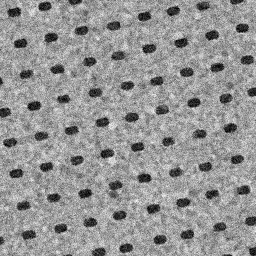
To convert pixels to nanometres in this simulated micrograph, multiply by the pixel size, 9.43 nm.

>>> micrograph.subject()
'a regular array of holes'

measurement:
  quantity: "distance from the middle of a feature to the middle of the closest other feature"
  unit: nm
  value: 284